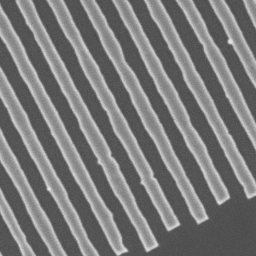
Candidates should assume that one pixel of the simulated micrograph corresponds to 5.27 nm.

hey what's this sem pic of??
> parallel lines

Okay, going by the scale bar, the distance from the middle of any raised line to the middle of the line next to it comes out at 150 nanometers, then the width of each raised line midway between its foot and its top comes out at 12.8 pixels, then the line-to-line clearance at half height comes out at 0.0829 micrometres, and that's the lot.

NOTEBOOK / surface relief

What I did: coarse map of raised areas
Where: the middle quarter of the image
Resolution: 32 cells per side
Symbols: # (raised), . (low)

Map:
....####.....###.....###.....###
.....####....####....####.....##
#....####.....####....###.....##
##....####....####....####....##
##....####.....####....####....#
###....####....####....####....#
###.....###.....####....####....
####....####.....###....####....
.###.....###.....####....####...
.####....####....####....####...
..###.....###.....####....####..
..####....####....####....####..
...###.....###.....####....####.
...####....####....####....####.
....####....####....####....###.
....####....####....####....####
.....####...####.....####....###
#....####....####....####.....##
#.....####....####....####....##
##....####....####.....###.....#
###....####....####....####....#
###....####.....###.....###.....
####....####....####....####....
####....####.....###.....###....
.###.....####....####....####...
.####....#####....###.....###...
..####....####....####....####..
..####....####.....###.....###..
...####....####....###......###.
...####....####....####.....###.
....####....####....####.....###
.....###....####.....###.....###